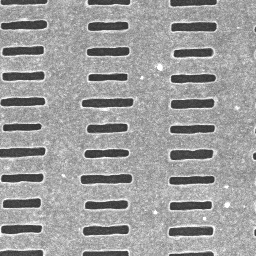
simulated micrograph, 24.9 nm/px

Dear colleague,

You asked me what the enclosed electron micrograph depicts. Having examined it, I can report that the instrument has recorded a regular array of holes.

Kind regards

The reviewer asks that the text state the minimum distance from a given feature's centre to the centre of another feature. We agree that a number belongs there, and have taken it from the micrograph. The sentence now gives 0.634 µm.